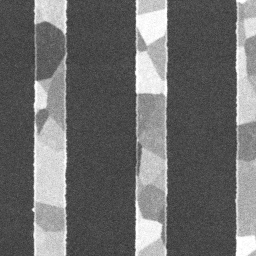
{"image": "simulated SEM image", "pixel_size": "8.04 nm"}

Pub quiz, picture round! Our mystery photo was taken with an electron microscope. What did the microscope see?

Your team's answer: one or a few lines or trenches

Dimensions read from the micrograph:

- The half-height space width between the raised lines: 0.571 µm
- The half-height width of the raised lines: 0.24 micrometres